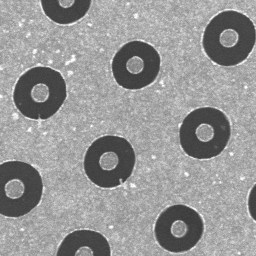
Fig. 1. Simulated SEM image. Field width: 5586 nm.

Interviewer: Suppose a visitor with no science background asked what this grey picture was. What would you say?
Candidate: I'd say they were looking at ring-shaped grooves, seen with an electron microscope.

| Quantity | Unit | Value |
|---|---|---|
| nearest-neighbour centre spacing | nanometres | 2110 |